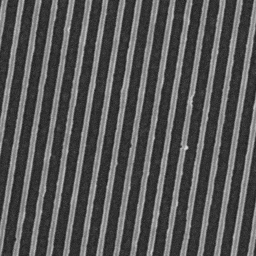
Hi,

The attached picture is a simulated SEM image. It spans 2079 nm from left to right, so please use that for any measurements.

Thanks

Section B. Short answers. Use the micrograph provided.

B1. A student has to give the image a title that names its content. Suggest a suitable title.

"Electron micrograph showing parallel lines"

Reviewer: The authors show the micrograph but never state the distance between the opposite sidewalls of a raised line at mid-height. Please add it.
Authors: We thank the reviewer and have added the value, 42.2 nm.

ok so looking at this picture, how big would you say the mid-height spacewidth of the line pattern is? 0.0982 µm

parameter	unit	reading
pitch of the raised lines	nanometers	135